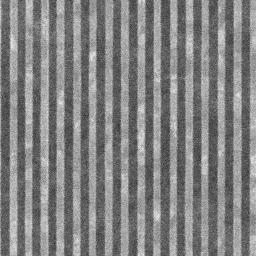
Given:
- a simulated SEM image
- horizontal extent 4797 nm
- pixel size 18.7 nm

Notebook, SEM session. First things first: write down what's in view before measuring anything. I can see parallel lines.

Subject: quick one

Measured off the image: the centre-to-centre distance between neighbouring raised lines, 300 nm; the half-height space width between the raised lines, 0.171 micrometres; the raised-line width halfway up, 129 nm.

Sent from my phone